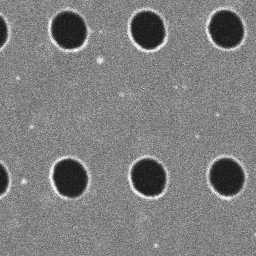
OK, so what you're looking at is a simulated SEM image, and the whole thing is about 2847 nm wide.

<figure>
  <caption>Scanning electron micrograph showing holes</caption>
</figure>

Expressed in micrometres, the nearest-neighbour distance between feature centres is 0.873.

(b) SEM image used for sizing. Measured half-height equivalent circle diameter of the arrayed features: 0.406 um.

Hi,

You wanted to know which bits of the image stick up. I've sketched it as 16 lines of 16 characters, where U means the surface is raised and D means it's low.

UUUUUUUUUUUUUUUU
UUUDDUUUDDUUUDDU
UUUDDUUUDDUUUDDU
UUUUUUUUUUUUUUUU
UUUUUUUUUUUUUUUU
UUUUUUUUUUUUUUUU
UUUUUUUUUUUUUUUU
UUUUUUUUUUUUUUUU
UUUUUUUUUUUUUUUU
UUUUUUUUUUUUUUUU
UUUDDUUUDDUUUDDU
UUUDDUUUDDUUUDDU
UUUUUUUUUUUUUUUU
UUUUUUUUUUUUUUUU
UUUUUUUUUUUUUUUU
UUUUUUUUUUUUUUUU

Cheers